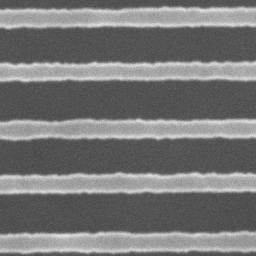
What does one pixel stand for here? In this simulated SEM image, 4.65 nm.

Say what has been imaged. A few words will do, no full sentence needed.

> lines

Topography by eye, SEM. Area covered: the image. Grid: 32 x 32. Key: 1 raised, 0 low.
00000000000000000000000000000000
11111111111111111111111111111111
11111111111111111111111111111111
01000000000000000000000000000000
00000000000000000000000000000000
00000000000000000000000000000000
00000000000000000000000000000000
00000000000000000000000000000000
11111111111111111111111111111111
11111111111111111111111111111111
00000000000000000000000000000000
00000000000000000000000000000000
00000000000000000000000000000000
00000000000000000000000000000000
00000000000000000000000000000000
11111111111111111111111111111111
11111111111111111111111111111111
00000000000000000000000000000000
00000000000000000000000000000000
00000000000000000000000000000000
00000000000000000000000000000000
00000000000000000000000000000000
11111111111111111111111111111111
11111111111111111111111111111111
00000000000000000000000000000000
00000000000000000000000000000000
00000000000000000000000000000000
00000000000000000000000000000000
00000000000000000000000000000000
11111111111111111111111111111111
11111111111111111111111111111111
00110000001001100000000000000000